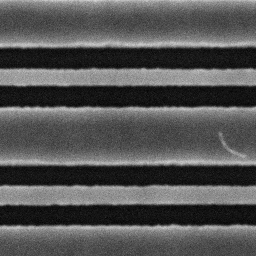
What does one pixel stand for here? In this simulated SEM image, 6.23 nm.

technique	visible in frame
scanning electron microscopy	lines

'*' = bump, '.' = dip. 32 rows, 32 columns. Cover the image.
********************************
********************************
********************************
********************************
********************************
********************************
................................
................................
................................
********************************
********************************
................................
................................
********************************
********************************
********************************
********************************
********************************
********************************
********************************
********************************
................................
................................
********************************
********************************
***********...*.................
................................
................................
********************************
********************************
********************************
********************************